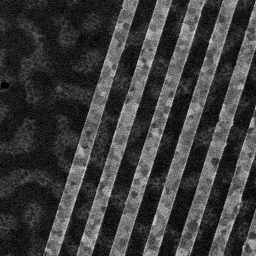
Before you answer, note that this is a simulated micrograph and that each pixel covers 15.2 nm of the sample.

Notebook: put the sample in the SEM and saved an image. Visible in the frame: parallel lines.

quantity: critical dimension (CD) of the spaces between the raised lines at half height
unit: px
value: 18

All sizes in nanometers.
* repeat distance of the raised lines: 479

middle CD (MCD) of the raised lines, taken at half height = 207 nm